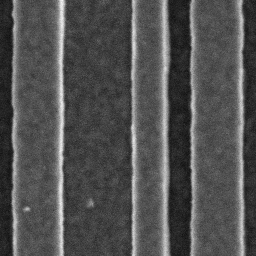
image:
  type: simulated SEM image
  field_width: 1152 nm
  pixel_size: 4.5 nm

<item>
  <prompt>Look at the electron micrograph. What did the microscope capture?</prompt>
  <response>lines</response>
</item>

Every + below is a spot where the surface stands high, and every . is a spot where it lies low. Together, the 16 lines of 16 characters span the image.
.+++....++..+++.
.+++....++..+++.
.+++....++..+++.
.+++....++..+++.
.+++....++..+++.
.+++....++..+++.
.+++....++..+++.
.+++....++..+++.
.+++....++..+++.
.+++....++..+++.
.+++....++..+++.
.+++....++..+++.
.+++....++..+++.
.+++....++..+++.
.+++....++..+++.
.+++....++..+++.